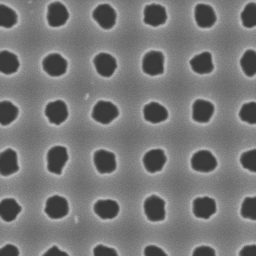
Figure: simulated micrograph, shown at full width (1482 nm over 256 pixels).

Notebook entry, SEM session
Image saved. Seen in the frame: a regular array of holes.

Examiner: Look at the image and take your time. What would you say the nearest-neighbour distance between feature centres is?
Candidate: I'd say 274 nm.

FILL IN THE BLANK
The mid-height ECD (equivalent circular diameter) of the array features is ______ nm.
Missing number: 129